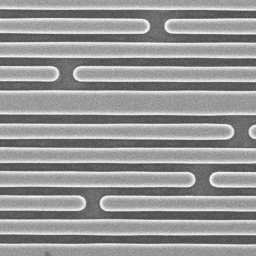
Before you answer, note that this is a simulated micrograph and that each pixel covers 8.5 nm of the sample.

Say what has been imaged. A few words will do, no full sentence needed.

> groups of lines, slits or small figures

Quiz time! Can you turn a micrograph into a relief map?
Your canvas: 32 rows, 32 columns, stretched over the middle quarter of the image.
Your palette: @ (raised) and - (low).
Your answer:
--------------------------------
---@@@@@@@@@@@@@@@@@@@@@@@@@@@@@
--@@@@@@@@@@@@@@@@@@@@@@@@@@@@@@
---@@@@@@@@@@@@@@@@@@@@@@@@@@@@@
--------------------------------
--------------------------------
--------------------------------
@@@@@@@@@@@@@@@@@@@@@@@@@@@@@@@@
@@@@@@@@@@@@@@@@@@@@@@@@@@@@@@@@
@@@@@@@@@@@@@@@@@@@@@@@@@@@@@@@@
@@@@@@@@@@@@@@@@@@@@@@@@@@@@@@@@
@@@@@@@@@@@@@@@@@@@@@@@@@@@@@@@@
------------@@@@@@@@@----@@@@@@@
--------------------------------
--------------------------------
@@@@@@@@@@@@@@@@@@@@@@@@@@@@@@@@
@@@@@@@@@@@@@@@@@@@@@@@@@@@@@@@@
@@@@@@@@@@@@@@@@@@@@@@@@@@@@@@@@
@@@@@@@@@@@@@@@@@@@@@@@@@@@@@@@@
--------------------------------
--------------------------------
@@@@@@@@@@@@@@@@@@@@@@@@@@@@@@@@
@@@@@@@@@@@@@@@@@@@@@@@@@@@@@@@@
@@@@@@@@@@@@@@@@@@@@@@@@@@@@@@@@
@@@@@@@@@@@@@@@@@@@@@@@@@@@@@@@@
--------------------------------
--------------------------------
@@@@@@@@@@@@@@@@@@@@@@@@@@@@@@@@
@@@@@@@@@@@@@@@@@@@@@@@@@@@@@@@@
@@@@@@@@@@@@@@@@@@@@@@@@@@@@@@@@
@@@@@@@@@@@@@@@@@@@@@@@----@@@@@
--------------------------------